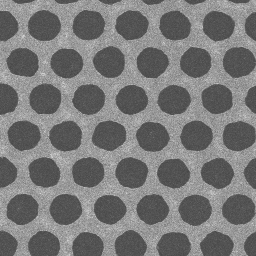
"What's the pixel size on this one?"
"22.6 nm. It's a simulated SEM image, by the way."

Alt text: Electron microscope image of a regular array of holes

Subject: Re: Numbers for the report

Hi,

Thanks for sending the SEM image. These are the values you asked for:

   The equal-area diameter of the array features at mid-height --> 706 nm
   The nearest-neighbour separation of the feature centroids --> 951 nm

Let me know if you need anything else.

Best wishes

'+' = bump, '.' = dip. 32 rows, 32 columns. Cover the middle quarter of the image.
.....+++.......+++........+++...
.....+++.......++++......++++...
....+++++.....+++++......++++++.
..+++++++++..++++++++..+++++++++
++++++++++++++++++++++++++++++++
++++....+++++++...++++++++...+++
+++......+++++......+++++......+
++........+++........+++.......+
++........+++........+++........
++........+++........++........+
+++.......+++........+++.......+
++++.....+++++......++++.......+
+++++...+++++++...++++++++...+++
++++++++++++++++++++++++++++++++
...++++++....+++++++....++++++++
....++++.......++++......+++++..
....++++.......+++.......+++++..
....+++.........++........+++...
....+++.........++........+++...
....+++........+++........+++...
....++++......+++++.......++++..
..++++++++..++++++++....+++++++.
++++++++++++++++++++++++++++++++
+++++..+++++++++.+++++++++++++++
+++......+++++......+++++.....++
++........+++........+++.......+
++........+++........++........+
++........+++........++.........
++........+++........+++.......+
+++......+++++......++++.......+
++++....++++++......+++++.....++
++++++++++++++++++++++++++++++++